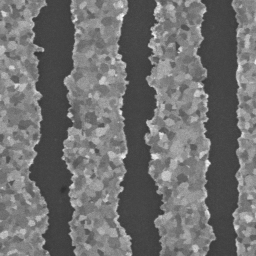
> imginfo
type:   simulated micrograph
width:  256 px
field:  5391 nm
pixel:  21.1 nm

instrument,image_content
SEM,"one or a few lines or trenches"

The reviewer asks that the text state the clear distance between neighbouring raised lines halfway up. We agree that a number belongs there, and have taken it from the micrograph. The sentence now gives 669 nm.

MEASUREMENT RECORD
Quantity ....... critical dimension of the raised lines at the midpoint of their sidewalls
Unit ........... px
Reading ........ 51.7